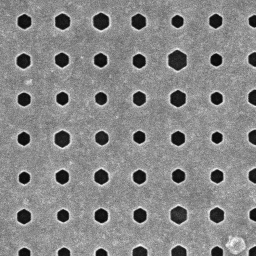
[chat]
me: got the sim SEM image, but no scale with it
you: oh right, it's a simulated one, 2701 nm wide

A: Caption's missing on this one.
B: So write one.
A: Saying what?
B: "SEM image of a regular array of holes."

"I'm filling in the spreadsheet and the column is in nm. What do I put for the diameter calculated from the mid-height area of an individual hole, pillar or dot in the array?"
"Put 151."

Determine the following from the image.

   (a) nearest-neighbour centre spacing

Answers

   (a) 402 nanometres